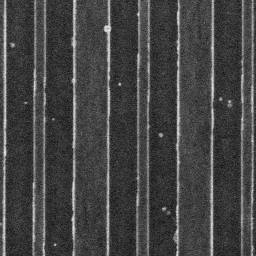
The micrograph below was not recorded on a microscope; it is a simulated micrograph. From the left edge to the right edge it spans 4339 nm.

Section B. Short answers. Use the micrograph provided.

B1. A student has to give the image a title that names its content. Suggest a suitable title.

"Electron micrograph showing lines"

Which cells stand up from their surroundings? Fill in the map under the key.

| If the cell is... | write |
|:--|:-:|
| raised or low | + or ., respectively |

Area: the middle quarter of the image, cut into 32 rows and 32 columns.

...++++++++........++........+++
...++++++++........++........+++
...++++++++........++.......++++
...++++++++........++.......++++
...++++++++........++.......++++
...++++++++........++.......++++
...++++++++........++.......++++
...++++++++........++.......++++
...++++++++........++.......++++
...++++++++........++.......++++
...++++++++........++.......++++
...++++++++........++.......++++
...++++++++........++.......++++
...++++++++........++.......++++
...++++++++........++.......++++
...++++++++........++.......++++
...++++++++........++.......++++
...++++++++........++.......++++
...++++++++........++.......++++
...++++++++........++.......++++
...++++++++........++.......++++
...++++++++........++.......++++
...++++++++........++.......++++
...++++++++........++.......++++
...++++++++........++.......++++
...++++++++........++.......++++
...++++++++........++.......++++
...++++++++........++.......++++
...++++++++........++.......++++
...++++++++........++.......++++
..+++++++++........++.......++++
..+++++++++........++.......++++